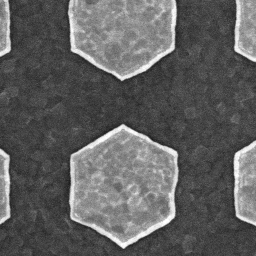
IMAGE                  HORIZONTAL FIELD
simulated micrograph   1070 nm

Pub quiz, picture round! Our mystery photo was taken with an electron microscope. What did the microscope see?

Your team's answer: raised bodies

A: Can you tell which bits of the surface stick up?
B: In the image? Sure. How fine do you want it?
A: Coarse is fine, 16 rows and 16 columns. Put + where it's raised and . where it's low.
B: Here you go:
+...+++++++....+
+...+++++++....+
+...+++++++....+
.....+++++.....+
.......++.......
................
................
................
.......++.......
.....++++++....+
.....++++++....+
+...+++++++....+
+...+++++++....+
.....++++++....+
......+++.......
................